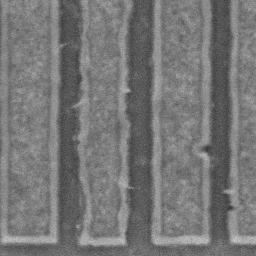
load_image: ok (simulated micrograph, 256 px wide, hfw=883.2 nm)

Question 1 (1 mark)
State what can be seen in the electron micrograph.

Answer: one or a few lines or trenches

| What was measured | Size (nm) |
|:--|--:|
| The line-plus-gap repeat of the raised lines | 262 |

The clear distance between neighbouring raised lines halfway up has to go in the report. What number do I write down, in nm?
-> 102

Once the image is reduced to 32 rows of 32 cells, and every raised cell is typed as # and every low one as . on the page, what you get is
#######....#####....######...###
.######....#####....######...###
.######....#####....######...###
.######....####.....######...###
.######...#####.....######...###
.######...#####.....######...###
#######....####.....######...###
#######...#####.....######...###
#######...#####.....######...###
#######...######....######...###
#######....####.....######...###
#######....####.....######...###
#######....####....#######...###
#######....####....#######....##
#######...#####....#######....##
#######...######....######...###
.######...######....######...###
.######...######....######...###
.######...#####.....#####....###
.######...#####.....######...###
.######...######...#######...###
.######...######....######...###
.######...#####.....######...###
.######....#####....######...###
#######....####.....######...###
#######....####.....######...###
#######....####.....######...###
#######....####.....######...###
#######....####....#######...###
.######...#####....#######...###
................................
................................